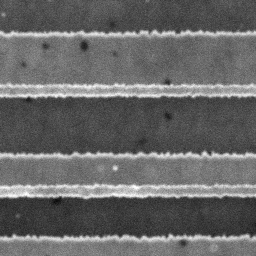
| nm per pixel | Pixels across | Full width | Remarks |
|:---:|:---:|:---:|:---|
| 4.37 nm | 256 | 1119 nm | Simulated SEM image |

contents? lines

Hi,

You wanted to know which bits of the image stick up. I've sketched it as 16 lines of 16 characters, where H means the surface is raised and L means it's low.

LLLLLLLLLLLLLLLL
LLLLLLLLLLLLLLLL
HHHHHHHHHHHHHHHH
HHHHHHHHHHHHHHHH
HHHHHHHHHHHHHHHH
HHHHHHHHHHHHHHHH
LLLLLLLLLLLLLLLL
LLLLLLLLLLLLLLLL
LLLLLLLLLLLLLLLL
LLLLLLLLLLLLLLLL
HHHHHHHHHHHHHHHH
HHHHHHHHHHHHHHHH
LLLLLLLLLLLLLLLL
LLLLLLLLLLLLLLLL
LLLLLLLLLLLLLLLL
HHHHHHHHHHHHHHHH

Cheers